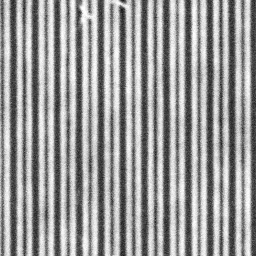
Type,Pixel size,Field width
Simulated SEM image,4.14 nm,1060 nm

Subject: parallel lines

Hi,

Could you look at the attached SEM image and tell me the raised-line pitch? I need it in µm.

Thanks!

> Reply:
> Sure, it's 0.0453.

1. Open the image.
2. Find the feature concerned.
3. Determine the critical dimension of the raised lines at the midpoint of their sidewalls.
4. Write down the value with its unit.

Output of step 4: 22.3 nm